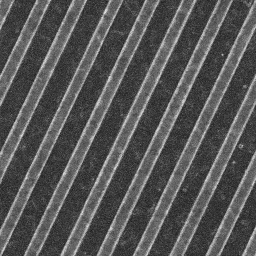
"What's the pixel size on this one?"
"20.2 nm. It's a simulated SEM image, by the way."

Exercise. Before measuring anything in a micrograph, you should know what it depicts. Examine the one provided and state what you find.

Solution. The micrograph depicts parallel lines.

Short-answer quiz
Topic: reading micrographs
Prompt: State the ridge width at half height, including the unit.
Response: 228 nm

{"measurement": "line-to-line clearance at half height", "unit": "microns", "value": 0.435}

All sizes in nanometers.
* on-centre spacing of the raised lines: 663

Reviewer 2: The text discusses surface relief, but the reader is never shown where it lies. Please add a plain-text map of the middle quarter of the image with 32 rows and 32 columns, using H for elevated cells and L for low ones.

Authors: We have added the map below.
LLLLHHHLLLLLLHHHLLLLLLHHHLLLLLLH
LLLHHHLLLLLLHHHLLLLLLLHHHLLLLLHH
LLLHHHLLLLLLHHHLLLLLLHHHLLLLLLHH
LLLHHLLLLLLHHHLLLLLLLHHHLLLLLLHH
LLHHHLLLLLLHHHLLLLLLHHHLLLLLLHHH
LLHHLLLLLLHHHLLLLLLLHHHLLLLLLHHH
LHHHLLLLLLHHHLLLLLLHHHLLLLLLHHHL
LHHLLLLLLHHHLLLLLLLHHHLLLLLLHHHL
HHHLLLLLLHHHLLLLLLHHHLLLLLLHHHLL
HHLLLLLLHHHLLLLLLLHHHLLLLLLHHHLL
HHLLLLLLHHHLLLLLLHHHLLLLLLHHHLLL
HLLLLLLLHHHLLLLLLHHHLLLLLLHHHLLL
HLLLLLLHHHLLLLLLHHHLLLLLLHHHLLLL
LLLLLLLHHHLLLLLLHHHLLLLLLHHHLLLL
LLLLLLHHHLLLLLLHHHLLLLLLHHHHLLLL
LLLLLLHHHLLLLLLHHHLLLLLLHHHLLLLL
LLLLLHHHLLLLLLHHHHLLLLLHHHHLLLLL
LLLLLHHHLLLLLLHHHLLLLLLHHHLLLLLL
LLLLHHHLLLLLLLHHLLLLLLHHHHLLLLLH
LLLLHHHLLLLLLHHHLLLLLLHHHLLLLLLH
LLLHHHLLLLLLLHHLLLLLLHHHHLLLLLLH
LLLHHHLLLLLLHHHLLLLLLHHHLLLLLLHH
LLLHHLLLLLLHHHLLLLLLHHHHLLLLLLHH
LLHHHLLLLLLHHHLLLLLLHHHLLLLLLHHH
LHHHLLLLLLHHHLLLLLLLHHHLLLLLLHHH
LHHHLLLLLLHHHLLLLLLHHHLLLLLLHHHL
HHHLLLLLLHHHLLLLLLLHHHLLLLLLHHHL
HHHLLLLLLHHHLLLLLLHHHLLLLLLHHHLL
HHLLLLLLLHHHLLLLLLHHHLLLLLLHHHLL
HHLLLLLLHHHLLLLLLHHHLLLLLLHHHLLL
HLLLLLLLHHHLLLLLLHHHLLLLLLHHHLLL
HLLLLLLHHHLLLLLLHHHLLLLLLHHHLLLL